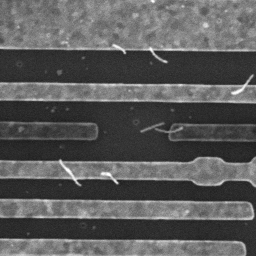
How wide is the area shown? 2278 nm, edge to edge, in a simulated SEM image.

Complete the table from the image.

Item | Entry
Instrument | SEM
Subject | wiring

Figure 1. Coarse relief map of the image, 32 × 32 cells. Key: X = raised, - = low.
XXXXXXXXXXXXXXXXXXXXXXXXXXXXXXXX
XXXXXXXXXXXXXXXXXXXXXXXXXXXXXXXX
XXXXXXXXXXXXXXXXXXXXXXXXXXXXXXXX
XXXXXXXXXXXXXXXXXXXXXXXXXXXXXXXX
XXXXXXXXXXXXXXXXXXXXXXXXXXXXXXXX
XXXXXXXXXXXXXXXXXXXXXXXXXXXXXXXX
--------------------------------
--------------------------------
--------------------------------
--------------------------------
XXXXXXXX------------------------
XXXXXXXXXXXXXXXXXXXXXXXXXXXXXXXX
-----XXXXXXXXXXXXXXXXXXXXXXXXXXX
--------------------------------
--------------------------------
XXXXXXXXXXXX--------------------
XXXXXXXXXXXX---------XXXXXXXXXXX
----------------------X--XXXXXXX
--------------------------------
--------------------------------
XXXXXXXXXXXXXXXXXXXXXXXXXXXXXXXX
XXXXXXXXXXXXXXXXXXXXXXXXXXXXXXXX
--------------X--------XXXXXX-XX
--------------------------------
--------------------------------
XXXXXXXXXXXXXXXXXXXXXXXXXXXXXXX-
XXXXXXXXXXXXXXXXXXXXXXXXXXXXXXXX
--------------------------------
--------------------------------
--------------------------------
XXXXXXXXXXXXXXXXXXXXXXXXXXXXXX--
XXXXXXXXXXXXXXXXXXXXXXXXXXXXXXX-